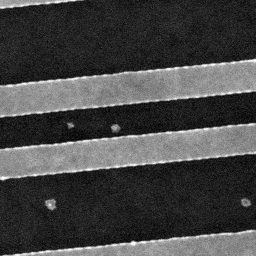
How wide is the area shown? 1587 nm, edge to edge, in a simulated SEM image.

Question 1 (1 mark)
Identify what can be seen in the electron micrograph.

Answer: lines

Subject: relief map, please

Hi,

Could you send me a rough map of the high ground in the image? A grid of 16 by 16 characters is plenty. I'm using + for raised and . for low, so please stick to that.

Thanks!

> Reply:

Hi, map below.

................
................
................
................
........++++++++
++++++++++++++++
++++++++........
................
........++++++++
++++++++++++++++
+++++++.........
................
................
................
...............+
.....+++++++++++